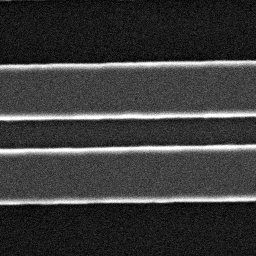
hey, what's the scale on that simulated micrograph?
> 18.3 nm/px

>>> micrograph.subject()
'lines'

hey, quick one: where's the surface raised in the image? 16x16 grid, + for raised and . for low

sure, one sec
................
................
................
................
++++++++++++++++
++++++++++++++++
++++++++++++++++
++++++++++++++++
++++++++++++++++
++++++++++++++++
++++++++++++++++
++++++++++++++++
+++++++++++++++.
................
................
................